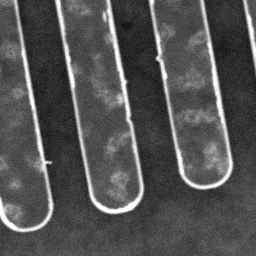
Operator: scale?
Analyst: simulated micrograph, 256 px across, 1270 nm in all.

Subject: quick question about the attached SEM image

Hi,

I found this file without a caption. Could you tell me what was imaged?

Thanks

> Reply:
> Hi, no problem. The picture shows one or a few lines or trenches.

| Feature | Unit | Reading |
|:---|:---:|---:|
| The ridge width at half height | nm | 257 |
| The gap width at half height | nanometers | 199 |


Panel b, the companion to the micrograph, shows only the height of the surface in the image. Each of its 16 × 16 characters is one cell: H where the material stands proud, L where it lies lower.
HLLLHHHLLHHHHLLH
HLLLHHHLLLHHHLLL
HLLLHHHLLLHHHLLL
HHLLHHHLLLHHHLLL
HHLLHHHHLLHHHLLL
HHLLHHHHLLHHHHLL
HHLLLHHHLLLHHHLL
HHLLLHHHLLLHHHLL
HHHLLHHHLLLHHHLL
HHHLLHHHHLLHHHLL
HHHLLHHHHLLHHHLL
HHHLLLHHHLLLHHLL
HHHLLLHHHLLLLLLL
HHHLLLLLLLLLLLLL
LLLLLLLLLLLLLLLL
LLLLLLLLLLLLLLLL